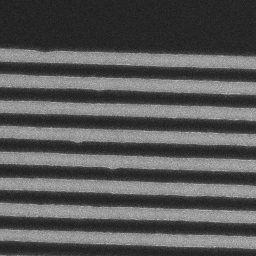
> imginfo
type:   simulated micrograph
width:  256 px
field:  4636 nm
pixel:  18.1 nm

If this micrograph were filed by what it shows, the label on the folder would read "parallel lines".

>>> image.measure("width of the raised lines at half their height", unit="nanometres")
260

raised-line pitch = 466 nm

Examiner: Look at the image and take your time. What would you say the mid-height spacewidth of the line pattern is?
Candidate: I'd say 11.5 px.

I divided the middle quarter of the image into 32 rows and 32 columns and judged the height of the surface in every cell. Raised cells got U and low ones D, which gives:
UUUUUUUUUUUUUUUUUUUUUUUDDDDDDDDD
UUUUUUUUUUUUUUUUUUUUUUUUUUUUUUUU
UUUUUUUUUUUUUUUUUUUUUUUUUUUUUUUU
DDDDDDDDDDDDUUDUUUUUUUUUUUUUUUUU
DDDDDDDDDDDDDDDDDDDDDDDDDDDDDDDD
DDDDDDDDDDDDDDDDDDDDDDDDDDDDDDDD
UUUUUUUUDUUUDDDDDDDDDDDDDDDDDDDD
UUUUUUUUUUUUUUUUUUUUUUUUUUUUUUUU
UUUUUUUUUUUUUUUUUUUUUUUUUUUUUUUU
UUUUUUUUUUUUUUUUUUUUUUUUUUUUUUUU
DDDDDDDDDDDDDDDDDDDDDDDDDDDDDUDD
DDDDDDDDDDDDDDDDDDDDDDDDDDDDDDDD
DDDDDDDDDDDDDDDDDDDDDDDDDDDDDDDD
UUUUUUUUUUUUUUUUUUUUUUUUUUUUUDDD
UUUUUUUUUUUUUUUUUUUUUUUUUUUUUUUU
UUUUUUUUUUUUUUUUUUUUUUUUUUUUUUUU
DDDDDDDDDDDDDDDDDUUUUUUUUUUUUUUU
DDDDDDDDDDDDDDDDDDDDDDDDDDDDDDDD
DDDDDDDDDDDDDDDDDDDDDDDDDDDDDDDD
UUUDUUUUUUUUUDDDDDDDDDDDDDDDDDDD
UUUUUUUUUUUUUUUUUUUUUUUUUUUUUUUU
UUUUUUUUUUUUUUUUUUUUUUUUUUUUUUUU
DDUUUUUUUUUUUUUUUUUUUUUUUUUUUUUU
DDDDDDDDDDDDDDDDDDDDDDDDDDDDDDUU
DDDDDDDDDDDDDDDDDDDDDDDDDDDDDDDD
UDDDDDDDDDDDDDDDDDDDDDDDDDDDDDDD
UUUUUUUUUUUUUUUUUUUUUUUUUUUUUUDD
UUUUUUUUUUUUUUUUUUUUUUUUUUUUUUUU
UUUUUUUUUUUUUUUUUUUUUUUUUUUUUUUU
DDDDDDDDDDDDDDDDDDDUUUUUUUUUUUUU
DDDDDDDDDDDDDDDDDDDDDDDDDDDDDDDD
DDDDDDDDDDDDDDDDDDDDDDDDDDDDDDDD